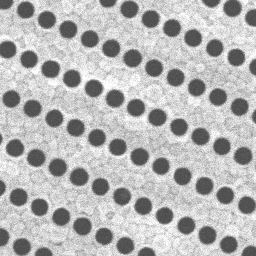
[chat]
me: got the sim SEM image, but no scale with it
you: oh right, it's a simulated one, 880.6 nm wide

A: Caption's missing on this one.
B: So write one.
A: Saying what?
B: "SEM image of a regular array of holes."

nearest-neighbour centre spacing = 0.08 um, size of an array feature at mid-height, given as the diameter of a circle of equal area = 60.3 nm